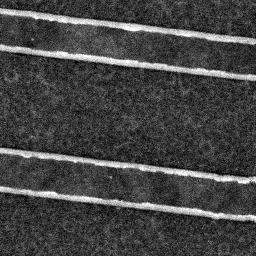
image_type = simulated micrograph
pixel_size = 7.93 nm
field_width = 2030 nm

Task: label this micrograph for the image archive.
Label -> one or a few lines or trenches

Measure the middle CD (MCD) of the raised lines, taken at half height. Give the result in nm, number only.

309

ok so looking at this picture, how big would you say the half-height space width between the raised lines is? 795 nanometers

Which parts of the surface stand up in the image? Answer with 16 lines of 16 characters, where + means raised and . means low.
................
+++++++.........
+++++++++++++++.
....++++++++++++
............++++
................
................
................
................
+...............
+++++++++.......
++++++++++++++++
.....+++++++++++
.............+++
................
................